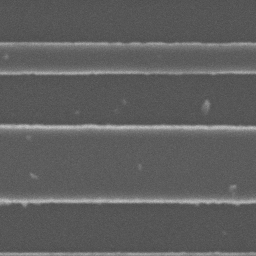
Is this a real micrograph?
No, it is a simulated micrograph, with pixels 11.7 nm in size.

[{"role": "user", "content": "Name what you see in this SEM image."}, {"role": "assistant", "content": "lines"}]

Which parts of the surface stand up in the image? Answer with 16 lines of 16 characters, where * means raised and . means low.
................
................
................
****************
****************
................
................
................
****************
****************
****************
****************
****************
................
................
................